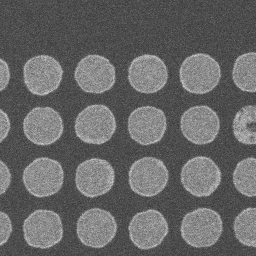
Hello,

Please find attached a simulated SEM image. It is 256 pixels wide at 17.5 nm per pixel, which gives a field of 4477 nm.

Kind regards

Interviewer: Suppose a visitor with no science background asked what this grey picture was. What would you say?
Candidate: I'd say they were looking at a regular array of raised bodies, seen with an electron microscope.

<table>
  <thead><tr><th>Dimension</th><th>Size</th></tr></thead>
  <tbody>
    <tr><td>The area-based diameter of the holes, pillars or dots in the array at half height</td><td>660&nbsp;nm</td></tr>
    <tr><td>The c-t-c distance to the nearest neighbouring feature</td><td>0.894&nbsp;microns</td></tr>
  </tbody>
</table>